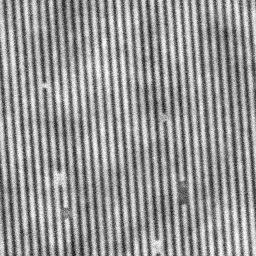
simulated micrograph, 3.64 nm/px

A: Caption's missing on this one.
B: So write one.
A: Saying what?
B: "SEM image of parallel lines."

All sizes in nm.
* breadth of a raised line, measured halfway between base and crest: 14.1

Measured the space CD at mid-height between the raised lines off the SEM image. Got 17.3 nm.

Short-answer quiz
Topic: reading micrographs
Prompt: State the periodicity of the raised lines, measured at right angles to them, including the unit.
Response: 30.6 nanometres